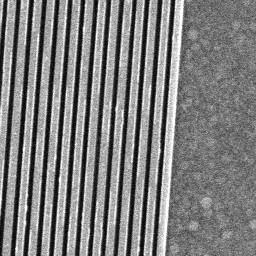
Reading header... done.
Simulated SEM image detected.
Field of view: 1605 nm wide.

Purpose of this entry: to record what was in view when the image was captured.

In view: parallel lines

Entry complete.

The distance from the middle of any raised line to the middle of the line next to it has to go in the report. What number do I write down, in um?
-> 0.0805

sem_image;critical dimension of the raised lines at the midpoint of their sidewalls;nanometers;49.3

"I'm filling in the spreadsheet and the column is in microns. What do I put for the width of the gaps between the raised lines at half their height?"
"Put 0.0305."